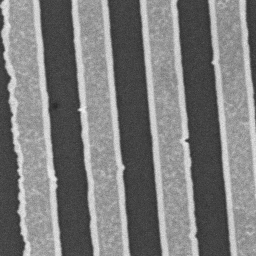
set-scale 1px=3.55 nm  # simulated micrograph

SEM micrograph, one or a few lines or trenches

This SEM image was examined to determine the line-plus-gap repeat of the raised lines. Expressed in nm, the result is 243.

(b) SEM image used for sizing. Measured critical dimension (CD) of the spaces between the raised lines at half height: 136 nanometers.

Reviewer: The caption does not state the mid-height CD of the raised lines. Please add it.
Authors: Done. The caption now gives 109 nm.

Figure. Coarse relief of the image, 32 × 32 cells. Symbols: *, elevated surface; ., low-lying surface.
.****....****.....****....****..
.****....****.....****.....***..
.****.....***.....****.....***..
.****.....***.....****.....****.
.****.....***.....****.....****.
.****.....****....****.....****.
.****.....****....****.....****.
.****.....****....****.....****.
.****.....****.....***.....****.
..***.....****.....***.....****.
..***.....****.....****....****.
.****.....****.....****....****.
..****....****.....****.....***.
..****....****.....****.....***.
..****....****.....****.....****
..****.....***.....****.....****
..****.....***.....****.....****
..****.....****....****.....****
..****.....****....****.....****
...***.....****.....***.....****
...***.....****.....***.....****
..****.....****.....***.....****
...****....****.....****....****
...****....****.....****.....***
...****....****.....****.....***
...****....****.....****.....***
...****.....***.....****.....***
...****.....***.....****.....***
...****.....****....****.....***
...****.....****....****.....***
...****.....****.....***.....***
...****.....****.....***.....***